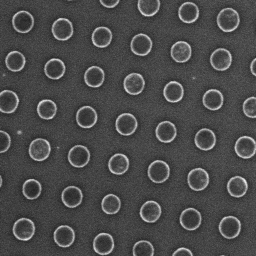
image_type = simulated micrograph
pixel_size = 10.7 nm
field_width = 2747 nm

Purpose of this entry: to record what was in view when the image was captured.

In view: a regular array of raised bodies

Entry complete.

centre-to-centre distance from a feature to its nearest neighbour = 430 nm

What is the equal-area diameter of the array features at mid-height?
0.221 µm